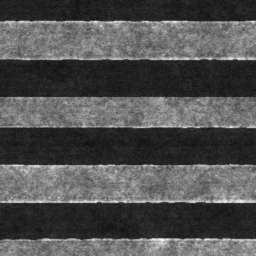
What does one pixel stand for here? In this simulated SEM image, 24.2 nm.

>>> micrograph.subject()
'lines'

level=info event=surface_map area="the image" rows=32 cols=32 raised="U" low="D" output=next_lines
DDDDDDDDDDDDDDDDDDDDDDDDDDDDDDDD
DDDDDDDDDDDDDDDDDDDDDDDDDDDDDDDD
DDDDDDDDDDDDDDDDDDDDDDDDDDDDDDDD
UUUUUUUUUUUUUUUUUUUUUUUUUUUUUUUU
UUUUUUUUUUUUUUUUUUUUUUUUUUUUUUUU
UUUUUUUUUUUUUUUUUUUUUUUUUUUUUUUU
UUUUUUUUUUUUUUUUUUUUUUUUUUUUUUUU
DDDDDDDDDDDDDDDDDDDDDDDDDDDDDDDD
DDDDDDDDDDDDDDDDDDDDDDDDDDDDDDDD
DDDDDDDDDDDDDDDDDDDDDDDDDDDDDDDD
DDDDDDDDDDDDDDDDDDDDDDDDDDDDDDDD
DDDDDDDDDDDDDDDDDDDDDDDDDDDDDDDD
UUUUUUUUUUUUUUUUUUUUUUUUUUUUUUUU
UUUUUUUUUUUUUUUUUUUUUUUUUUUUUUUU
UUUUUUUUUUUUUUUUUUUUUUUUUUUUUUUU
UUUUUUUUUUUUUUUUUUUUUUUUUUUUUUUU
DDDDDDDDDDDDDDDDDDDDDDDDDDDDDDDD
DDDDDDDDDDDDDDDDDDDDDDDDDDDDDDDD
DDDDDDDDDDDDDDDDDDDDDDDDDDDDDDDD
DDDDDDDDDDDDDDDDDDDDDDDDDDDDDDDD
DDDDDDDDDDDDDDDDDDDDDDDDDDDDDDDD
UUUUUUUUUUUUUUUUUUUUUUUUUUUUUUUU
UUUUUUUUUUUUUUUUUUUUUUUUUUUUUUUU
UUUUUUUUUUUUUUUUUUUUUUUUUUUUUUUU
UUUUUUUUUUUUUUUUUUUUUUUUUUUUUUUU
DDDDDDDDDDDDDDDDDDDDDDDDDDDDDDDD
DDDDDDDDDDDDDDDDDDDDDDDDDDDDDDDD
DDDDDDDDDDDDDDDDDDDDDDDDDDDDDDDD
DDDDDDDDDDDDDDDDDDDDDDDDDDDDDDDD
DDDDDDDDDDDDDDDDDDDDDDDDDDDDDDDD
UUUUUUUUUUUUUUUUUUUUUUUUUUUUUUUU
UUUUUUUUUUUUUUUUUUUUUUUUUUUUUUUU